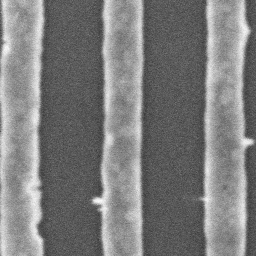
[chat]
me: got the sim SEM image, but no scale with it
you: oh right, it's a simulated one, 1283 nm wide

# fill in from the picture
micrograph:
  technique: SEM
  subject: one or a few lines or trenches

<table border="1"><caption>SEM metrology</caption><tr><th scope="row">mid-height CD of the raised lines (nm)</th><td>185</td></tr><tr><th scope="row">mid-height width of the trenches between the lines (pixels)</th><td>65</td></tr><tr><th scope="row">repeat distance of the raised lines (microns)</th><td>0.513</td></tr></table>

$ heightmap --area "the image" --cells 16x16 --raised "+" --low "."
+++....++....++.
+++....++....++.
+++....++....++.
++....+++....++.
++.....++....++.
++.....++....++.
++.....++....++.
++.....++....++.
++.....++....++.
++....+++....++.
++....+++....++.
++....+++....++.
++....+++....++.
++....+++....++.
++....+++....++.
+++...+++....++.